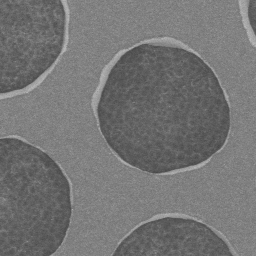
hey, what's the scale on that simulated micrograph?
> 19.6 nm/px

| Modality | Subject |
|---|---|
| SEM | holes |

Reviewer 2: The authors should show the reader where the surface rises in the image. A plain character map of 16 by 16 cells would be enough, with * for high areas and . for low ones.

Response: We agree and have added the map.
....***********.
....************
....************
....****....****
...****......***
.*****........**
******........**
******........**
******........**
...****.......**
....*****..*****
....************
....************
....************
....****......**
....***........*